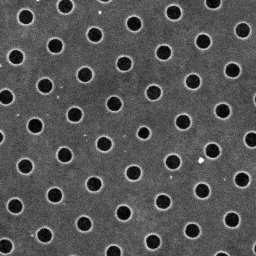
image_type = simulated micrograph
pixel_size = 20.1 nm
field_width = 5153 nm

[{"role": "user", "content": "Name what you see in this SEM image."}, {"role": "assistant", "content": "a regular array of holes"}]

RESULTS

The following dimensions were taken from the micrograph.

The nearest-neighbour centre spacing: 40.9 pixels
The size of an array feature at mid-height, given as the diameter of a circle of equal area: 296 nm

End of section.